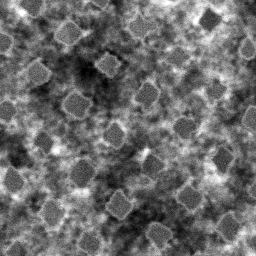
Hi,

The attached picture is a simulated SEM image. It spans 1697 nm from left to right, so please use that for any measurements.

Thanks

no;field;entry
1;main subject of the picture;a regular array of raised bodies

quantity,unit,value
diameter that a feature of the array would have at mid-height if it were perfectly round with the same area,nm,160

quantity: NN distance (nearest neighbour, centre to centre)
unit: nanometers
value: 209